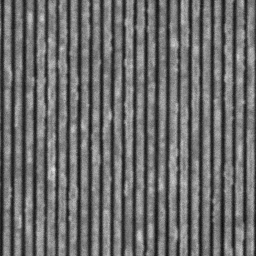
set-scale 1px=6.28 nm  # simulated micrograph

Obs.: parallel lines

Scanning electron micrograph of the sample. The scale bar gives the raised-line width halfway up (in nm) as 40.8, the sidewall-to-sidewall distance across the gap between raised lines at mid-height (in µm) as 0.029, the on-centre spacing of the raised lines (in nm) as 69.5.